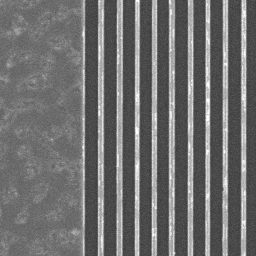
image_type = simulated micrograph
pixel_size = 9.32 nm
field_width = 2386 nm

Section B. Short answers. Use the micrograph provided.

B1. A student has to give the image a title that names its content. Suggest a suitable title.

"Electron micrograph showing parallel lines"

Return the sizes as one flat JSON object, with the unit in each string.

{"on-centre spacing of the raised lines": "167 nm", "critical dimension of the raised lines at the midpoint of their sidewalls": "43.1 nm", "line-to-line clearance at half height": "121 nanometers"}